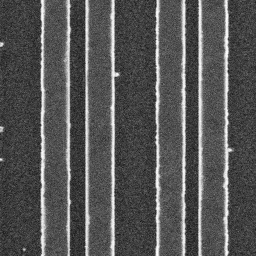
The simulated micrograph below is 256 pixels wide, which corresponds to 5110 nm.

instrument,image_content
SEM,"lines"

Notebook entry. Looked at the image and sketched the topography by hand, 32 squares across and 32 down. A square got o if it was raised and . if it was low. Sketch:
.....oooo..ooo......ooo..ooo....
.....oooo..ooo......ooo..ooo....
.....oooo..ooo......ooo..ooo....
.....oooo..ooo......ooo..ooo....
.....oooo..ooo......ooo..ooo....
.....oooo..ooo......ooo..ooo....
.....oooo..ooo......ooo..ooo....
.....ooo...ooo......ooo..ooo....
.....oooo..ooo......ooo..ooo....
.....oooo..ooo......ooo..ooo....
.....oooo..ooo......ooo..ooo....
.....oooo..ooo......ooo..ooo....
.....oooo..ooo......ooo..ooo....
.....oooo..ooo......ooo..ooo....
.....oooo..ooo......ooo..ooo....
.....oooo..ooo......ooo..ooo....
.....oooo..ooo......ooo..ooo....
.....oooo..ooo......ooo..ooo....
.....oooo..ooo......ooo..ooo....
.....oooo..ooo......ooo..ooo....
.....oooo..ooo......ooo..ooo....
.....oooo..ooo......ooo..ooo....
.....oooo..ooo......ooo..ooo....
.....oooo..ooo......ooo..ooo....
.....oooo..ooo......ooo..ooo....
.....oooo..ooo......ooo..ooo....
.....oooo..ooo......ooo..ooo....
.....oooo..ooo......ooo..ooo....
.....oooo..ooo......ooo..ooo....
.....oooo..ooo......ooo..ooo....
.....oooo..ooo......ooo..ooo....
.....oooo..ooo......ooo..ooo....